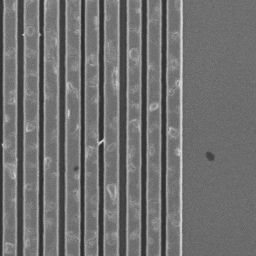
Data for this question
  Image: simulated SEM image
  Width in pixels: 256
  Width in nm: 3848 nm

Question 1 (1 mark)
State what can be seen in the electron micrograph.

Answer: parallel lines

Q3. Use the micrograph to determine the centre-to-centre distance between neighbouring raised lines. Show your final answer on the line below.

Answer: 308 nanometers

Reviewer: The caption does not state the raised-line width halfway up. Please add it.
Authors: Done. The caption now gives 220 nanometers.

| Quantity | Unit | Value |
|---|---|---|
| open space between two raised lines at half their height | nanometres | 77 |